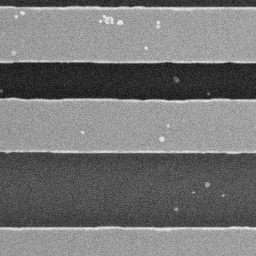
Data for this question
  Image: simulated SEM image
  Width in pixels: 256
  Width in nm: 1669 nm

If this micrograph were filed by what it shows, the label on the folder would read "lines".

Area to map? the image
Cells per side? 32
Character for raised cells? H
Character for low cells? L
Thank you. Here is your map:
LLLLLLLLLLLLLLLLLLLLLLLLLLLLLLLL
HHHHHHHHHHHHHHHHHHHHHHHHHHHHHHHH
HHHHHHHHHHHHHHHHHHHHHHHHHHHHHHHH
HHHHHHHHHHHHHHHHHHHHHHHHHHHHHHHH
HHHHHHHHHHHHHHHHHHHHHHHHHHHHHHHH
HHHHHHHHHHHHHHHHHHHHHHHHHHHHHHHH
HHHHHHHHHHHHHHHHHHHHHHHHHHHHHHHH
HHHHHHHHHHHHHHHHHHHHHHHHHHHHHHHH
LLLLLLLLLLLLLLLLLLLLLLLLLLLLLLLL
LLLLLLLLLLLLLLLLLLLLLLLLLLLLLLLL
LLLLLLLLLLLLLLLLLLLLLLLLLLLLLLLL
LLLLLLLLLLLLLLLLLLLLLLLLLLLLLLLL
HHHLHHLHHHHHHHHLLLLLLLLLLLHHHLLL
HHHHHHHHHHHHHHHHHHHHHHHHHHHHHHHH
HHHHHHHHHHHHHHHHHHHHHHHHHHHHHHHH
HHHHHHHHHHHHHHHHHHHHHHHHHHHHHHHH
HHHHHHHHHHHHHHHHHHHHHHHHHHHHHHHH
HHHHHHHHHHHHHHHHHHHHHHHHHHHHHHHH
HHHHHHHHHHHHHHHHHHHHHHHHHHHHHHHH
LLLLLLLLLLLLLLLLLLLLLLLLLLLLLLLL
LLLLLLLLLLLLLLLLLLLLLLLLLLLLLLLL
LLLLLLLLLLLLLLLLLLLLLLLLLLLLLLLL
LLLLLLLLLLLLLLLLLLLLLLLLLLLLLLLL
LLLLLLLLLLLLLLLLLLLLLLLLLLLLLLLL
LLLLLLLLLLLLLLLLLLLLLLLLLLLLLLLL
LLLLLLLLLLLLLLLLLLLLLLLLLLLLLLLL
LLLLLLLLLLLLLLLLLLLLLLLLLLLLLLLL
LLLLLLLLLLLLLLLLLLLLLLLLLLLLLLLL
LLLLLLLLLLLLHHHLLLLLLLLLLLLLHHHL
HHHHHHHHHHHHHHHHHHHHHHHHHHHHHHHH
HHHHHHHHHHHHHHHHHHHHHHHHHHHHHHHH
HHHHHHHHHHHHHHHHHHHHHHHHHHHHHHHH